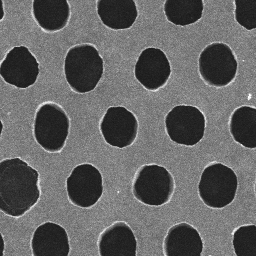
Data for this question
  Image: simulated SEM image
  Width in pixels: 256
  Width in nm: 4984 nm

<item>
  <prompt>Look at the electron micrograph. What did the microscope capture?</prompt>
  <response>a regular array of holes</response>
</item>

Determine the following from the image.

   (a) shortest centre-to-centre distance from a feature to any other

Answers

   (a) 1280 nm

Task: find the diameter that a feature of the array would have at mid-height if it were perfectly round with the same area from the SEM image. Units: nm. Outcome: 775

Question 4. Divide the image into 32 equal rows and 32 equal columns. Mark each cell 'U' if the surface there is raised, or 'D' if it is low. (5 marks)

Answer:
UUUUDDDDUUUUDDDDDUUUUDDDDUUUUDDD
UUUUDDDDDUUUDDDDDUUUUDDDDUUUUDDD
UUUUUDDDUUUUUDDDDUUUUDDDDUUUUUDD
UUUUUUDDUUUUUUDDUUUUUUUUUUUUUUUD
UUUUUUUUUUUUUUUUUUUUUUUUUUUUUUUU
UUUUUUUUUUUUUUUUUUUUUUUUUUDDUUUU
UDDDUUUUUDDDUUUUUUDDUUUUUDDDDUUU
UDDDUUUUDDDDDUUUUDDDDUUUUDDDDUUU
DDDDDUUUDDDDDUUUUDDDDUUUUDDDDDUU
DDDDDUUUDDDDDUUUUDDDDUUUUDDDDUUU
UDDDUUUUUDDDUUUUUUDDUUUUUUUDUUUU
UUUUUUUUUUDUUUUUUUUUUUUUUUUUUUUU
UUUUUUUUUUUUUUUUUUUUUUUUUUUUUUUU
UUUUUDDUUUUUUUDUUUUUUUDDDUUUUUDD
UUUUUDDDUUUUUDDDDUUUUDDDDUUUUDDD
UUUUDDDDDUUUUDDDDUUUUDDDDDUUUDDD
UUUUDDDDDUUUUDDDDUUUUDDDDUUUUDDD
UUUUUDDDUUUUUDDDDUUUUUDDDUUUUDDD
UUUUUDDDUUUUUUUUUUUUUUUUUUUUUUUU
UUUUUUUUUUUUUUUUUUUUUUUUUUUUUUUU
DDDUUUUUUUUUUUUUUUUUUUUUUUUDUUUU
DDDDDUUUUDDDUUUUUUDDDUUUUDDDDUUU
DDDDDUUUDDDDDUUUUDDDDDUUUDDDDDUU
DDDDDUUUDDDDDUUUUDDDDUUUUDDDDDUU
DDDDDUUUUDDDDUUUUDDDDUUUUDDDDUUU
DDDDUUUUUDDDUUUUUUDDUUUUUUDDUUUU
DDDUUUUUUUUUUUUUUUUUUUUUUUUUUUUU
UUUUUUUUUUUUUUUUUUUUUUUUUUUUUUUU
UUUUUDDDUUUUUUDDUUUUUUDDUUUUUUDD
UUUUDDDDUUUUUDDDDUUUUDDDDUUUUDDD
UUUUDDDDDUUUDDDDDUUUUDDDDUUUUDDD
UUUUDDDDDUUUDDDDDUUUUDDDDUUUUDDD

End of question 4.